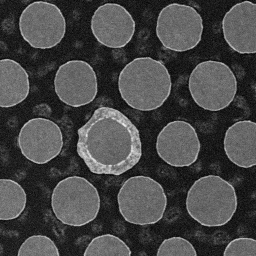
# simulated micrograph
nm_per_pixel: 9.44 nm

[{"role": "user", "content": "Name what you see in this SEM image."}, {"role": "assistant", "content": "a regular array of raised bodies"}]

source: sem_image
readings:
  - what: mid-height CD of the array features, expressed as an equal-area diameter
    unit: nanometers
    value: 442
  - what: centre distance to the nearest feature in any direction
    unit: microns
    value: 0.627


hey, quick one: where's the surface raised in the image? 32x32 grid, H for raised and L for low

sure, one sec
LLLLHHLLLLLLLLLLLLLLLLLLLLLLLLHH
LLLHHHHHLLLLHHHHLLLLHHHHHLLLLHHH
LLLHHHHHLLLLHHHHHLLLHHHHHLLLHHHH
LLLHHHHHLLLLHHHHHLLLHHHHHLLLHHHH
LLLHHHHHLLLLHHHHLLLLHHHHHLLLHHHH
LLLLHHHLLLLLLHHHLLLLHHHHHLLLLHHH
LLLLLLLLLLLLLLLLLLLLLLLLLLLLLLHH
HLLLLLLLLLLLLLLLLHHLLLLLLLLLLLLL
HHHLLLLLHHHLLLLLHHHHHLLLHHHHHLLL
HHHLLLLHHHHHLLLHHHHHHLLLHHHHHLLL
HHHHLLLHHHHHLLLHHHHHHLLLHHHHHHLL
HHHLLLLHHHHHLLLHHHHHHLLLHHHHHLLL
HHHLLLLLHHHLLLLLHHHHHLLLHHHHHLLL
LLLLLHLLLLLLLHLLLHHHLLLLLLHHLLLL
LLLLLLLLLLLLHHHHLLLLLLLLLLLLLLLL
LLLHHHHLLLLHHHHHHLLLLHHHLLLLLHHH
LLLHHHHHLLHHHHHHHLLLHHHHLLLLHHHH
LLHHHHHHLLHHHHHHHHLLHHHHHLLLHHHH
LLLHHHHHLLHHHHHHHHLLHHHHHLLLHHHH
LLLHHHHLLLHHHHHHHHLLHHHHHLLLHHHH
LLLLLLLLLLLHHHHHHLLLLHHHLLLLLHHH
LLLLLLLLLLLLHHHLLLLLLLLLLLLLLLLL
HLLLLLLLHHHLLLLLHHHLLLLLLHHHLLLL
HHHLLLLHHHHHLLLHHHHHLLLLHHHHHLLL
HHHLLLLHHHHHLLLHHHHHHLLHHHHHHLLL
HHHLLLLHHHHHLLLHHHHHHLLHHHHHHLLL
HHHLLLLHHHHHLLLHHHHHLLLLHHHHHLLL
LLLLLLLLHHHLLLLLHHHHLLLLLHHHHLLL
LLLLLLLLLLLLLLLLLLLLLLLLLLLLLLLL
LLLLLLLLLLLLLHLLLLLLLLLLLLLLLLLL
LLLHHHHLLLLHHHHHLLLLHHHHLLLLLHHH
LLHHHHHLLLLHHHHHLLLLHHHHLLLLHHHH